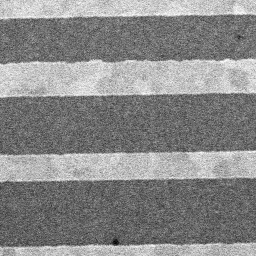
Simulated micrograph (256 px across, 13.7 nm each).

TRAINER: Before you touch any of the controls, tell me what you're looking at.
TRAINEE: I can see one or a few lines or trenches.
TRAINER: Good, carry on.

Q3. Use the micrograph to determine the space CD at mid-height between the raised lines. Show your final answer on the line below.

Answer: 0.819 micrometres